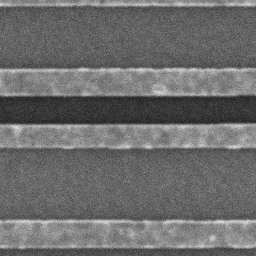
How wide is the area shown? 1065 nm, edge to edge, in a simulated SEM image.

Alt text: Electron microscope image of lines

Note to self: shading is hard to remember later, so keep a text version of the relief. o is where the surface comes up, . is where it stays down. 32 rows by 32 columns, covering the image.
oooooooooooooooooooooooooooooooo
................................
................................
................................
................................
................................
................................
................................
................................
oooooooooooooooooooooooooooooooo
oooooooooooooooooooooooooooooooo
oooooooooooooooooooooooooooooooo
................................
................................
................................
................................
oooooooooooooooooooooooooooooooo
oooooooooooooooooooooooooooooooo
................................
................................
................................
................................
................................
................................
................................
................................
................................
................................
oooooooooooooooooooooooooooooooo
oooooooooooooooooooooooooooooooo
oooooooooooooooooooooooooooooooo
................................